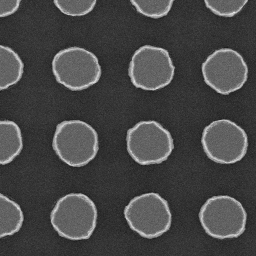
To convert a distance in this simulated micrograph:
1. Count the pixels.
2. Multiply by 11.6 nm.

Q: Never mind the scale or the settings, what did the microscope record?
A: a regular array of raised bodies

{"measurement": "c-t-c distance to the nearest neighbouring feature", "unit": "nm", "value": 854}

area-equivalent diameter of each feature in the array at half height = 511 nanometers